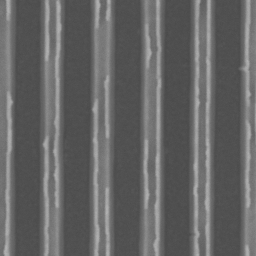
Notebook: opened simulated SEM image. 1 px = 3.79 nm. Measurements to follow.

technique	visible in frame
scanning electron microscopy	parallel lines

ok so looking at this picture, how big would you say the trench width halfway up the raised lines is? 0.117 microns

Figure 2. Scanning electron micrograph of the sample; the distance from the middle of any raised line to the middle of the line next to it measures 189 nanometres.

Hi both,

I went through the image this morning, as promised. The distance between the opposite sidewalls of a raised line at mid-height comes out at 71.9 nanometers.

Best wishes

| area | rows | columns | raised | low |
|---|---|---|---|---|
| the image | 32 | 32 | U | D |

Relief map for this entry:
UUDDDUUUDDDDUUDDDDUUDDDDUUUDDDDU
UDDDDDUUDDDDUUDDDDUUDDDDUUUDDDUU
UDDDDDUUDDDDUUDDDDUUDDDDUUUDDDUU
UDDDDDUUDDDDUUDDDDUUDDDDUUUDDDDU
UDDDDDUUDDDDUUDDDDUUDDDDUUUDDDDU
UDDDDDUUDDDDUUDDDDUUDDDDUUUDDDDU
UDDDDDUUDDDDUUDDDDUUDDDDUUUDDDDU
UDDDDDUUDDDDUUDDDDUUDDDDUUDDDDUU
UDDDDDUUDDDDUUDDDDUUDDDDUUDDDDUU
UUDDDDUUDDDDUUDDDDUUDDDDUUDDDDUU
UUDDDDUUDDDDUUDDDDUUDDDDUUDDDDUU
UDDDDUUUDDDDUUDDDDUUDDDDUUDDDDUU
UUDDDDUUDDDDUUDDDDUUDDDDUUDDDDDU
UDDDDDUDDDDDUUDDDDUUDDDDUUDDDDDU
UDDDDDUDDDDDUUDDDDUUDDDDUUDDDDDU
UDDDDDUDDDDDUUDDDDUUDDDDUUDDDDDU
UUDDDDUDDDDDUUDDDDUUDDDDUUDDDDDU
UUDDDUUDDDDDUUDDDDUUDDDDUUDDDDDU
UDDDDUUUDDDDUUDDDDUUDDDDUUDDDDDU
UDDDDDUUDDDDUUDDDDUUDDDDUUDDDDDU
UDDDDDUUDDDDUUDDDDUUDDDDUUDDDDDU
UUDDDUUUDDDDUUDDDDUUDDDDUUDDDDDU
UUDDDUUUDDDDUUDDDDUUDDDDUUDDDDDU
UUDDDUUUDDDDUUDDDDUUDDDDUUDDDDDU
UDDDDUUUDDDDUUDDDDUUDDDDUUDDDDDU
UDDDDUUUDDDDUUDDDDUUDDDDUUDDDDDU
UDDDDUUUDDDDUUDDDDUUDDDDUUDDDDUU
UDDDDUUUDDDDUUDDDDUUDDDDUUDDDDUU
UDDDDUUUDDDDUUDDDDUUDDDDUUDDDDUU
UDDDDUUUDDDDUUDDDDUUDDDDUUDDDDUU
UDDDDUUUDDDDUUDDDDUUDDDDUUDDDDUU
UDDDDUUDDDDDUUDDDDUUDDDDUUDDDDUU